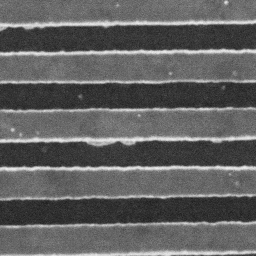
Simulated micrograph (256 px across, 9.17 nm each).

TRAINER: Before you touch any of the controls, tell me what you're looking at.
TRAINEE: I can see lines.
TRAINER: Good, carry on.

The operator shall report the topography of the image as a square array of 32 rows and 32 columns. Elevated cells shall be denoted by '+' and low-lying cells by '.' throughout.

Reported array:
++++++++++++++++++++++++++++++++
++++++++++++++++++++++++++++++++
++++++++++++++++++++++++++++++++
................................
................................
................................
..++...+++++++++++++++++++++++++
++++++++++++++++++++++++++++++++
++++++++++++++++++++++++++++++++
++++++++++++++++++++++++++++++++
................................
................................
................................
............................++.+
++++++++++++++++++++++++++++++++
++++++++++++++++++++++++++++++++
++++++++++++++++++++++++++++++++
++++++++++++++++++++++++++++++..
................................
................................
................................
++++++++++++++++++++++++++++++++
++++++++++++++++++++++++++++++++
++++++++++++++++++++++++++++++++
++++++++++++++++++++++++++++++++
................................
................................
................................
++++++++++++++++++++++++++++++++
++++++++++++++++++++++++++++++++
++++++++++++++++++++++++++++++++
++++++++++++++++++++++++++++++++